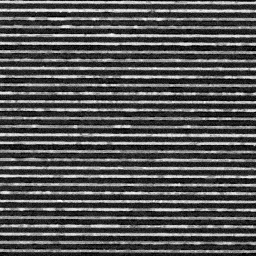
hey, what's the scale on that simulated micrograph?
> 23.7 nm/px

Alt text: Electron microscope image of parallel lines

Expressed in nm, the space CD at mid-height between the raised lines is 157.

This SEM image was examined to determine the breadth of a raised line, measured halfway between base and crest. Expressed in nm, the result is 44.4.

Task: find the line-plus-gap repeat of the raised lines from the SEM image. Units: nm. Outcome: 196